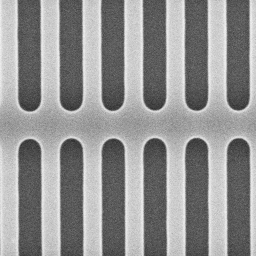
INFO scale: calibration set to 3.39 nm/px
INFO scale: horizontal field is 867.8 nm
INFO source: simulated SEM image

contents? groups of lines, slits or small figures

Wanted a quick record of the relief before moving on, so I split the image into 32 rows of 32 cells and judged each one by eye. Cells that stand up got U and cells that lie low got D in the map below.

UUDDDUUDDDUUUDDDUUDDDUUDDDUUDDDU
UUDDDUUDDDUUUDDDUUDDDUUDDDUUDDDU
UUDDDUUDDDUUUDDDUUDDDUUDDDUUDDDU
UUDDDUUDDDUUUDDDUUDDDUUDDDUUDDDU
UUDDDUUDDDUUUDDDUUDDDUUDDDUUDDDU
UUDDDUUDDDUUUDDDUUDDDUUDDDUUDDDU
UUDDDUUDDDUUUDDDUUDDDUUDDDUUDDDU
UUDDDUUDDDUUUDDDUUDDDUUDDDUUDDDU
UUDDDUUDDDUUUDDDUUDDDUUDDDUUDDDU
UUDDDUUDDDUUUDDDUUDDDUUDDDUUDDDU
UUDDDUUDDDUUUDDDUUDDDUUDDDUUDDDU
UUDDDUUDDDUUUDDDUUDDDUUDDDUUDDDU
UUDDDUUDDDUUUDDDUUDDDUUDDDUUDDDU
UUUDDUUUDDUUUDDUUUDDUUUUDDUUUDDU
UUUUUUUUUUUUUUUUUUUUUUUUUUUUUUUU
UUUUUUUUUUUUUUUUUUUUUUUUUUUUUUUU
UUUUUUUUUUUUUUUUUUUUUUUUUUUUUUUU
UUUDUUUUDDUUUDDUUUUDUUUUDUUUUDDU
UUDDDUUDDDUUUDDDUUDDDUUDDDUUDDDU
UUDDDUUDDDUUUDDDUUDDDUUDDDUUDDDU
UUDDDUUDDDUUUDDDUUDDDUUDDDUUDDDU
UUDDDUUDDDUUUDDDUUDDDUUDDDUUDDDU
UUDDDUUDDDUUUDDDUUDDDUUDDDUUDDDU
UUDDDUUDDDUUUDDDUUDDDUUDDDUUDDDU
UUDDDUUDDDUUUDDDUUDDDUUDDDUUDDDU
UUDDDUUDDDUUUDDDUUDDDUUDDDUUDDDU
UUDDDUUDDDUUUDDDUUDDDUUDDDUUDDDU
UUDDDUUDDDUUUDDDUUDDDUUDDDUUDDDU
UUDDDUUDDDUUUDDDUUDDDUUDDDUUDDDU
UUDDDUUDDDUUUDDDUUDDDUUDDDUUDDDU
UUDDDUUDDDUUUDDDUUDDDUUDDDUUDDDU
UUDDDUUDDDUUUDDDUUDDDUUDDDUUDDDU